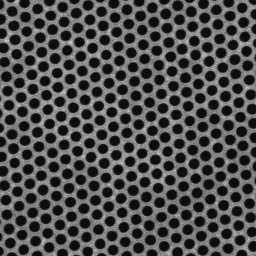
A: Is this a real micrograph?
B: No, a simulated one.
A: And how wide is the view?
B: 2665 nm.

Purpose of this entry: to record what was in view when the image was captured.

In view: a regular array of holes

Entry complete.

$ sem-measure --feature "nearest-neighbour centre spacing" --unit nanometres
148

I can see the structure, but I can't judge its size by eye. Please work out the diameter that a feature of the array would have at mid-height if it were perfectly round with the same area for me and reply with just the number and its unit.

104 nm